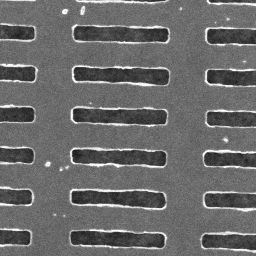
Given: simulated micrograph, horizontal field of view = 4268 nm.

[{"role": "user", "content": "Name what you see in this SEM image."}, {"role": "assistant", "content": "holes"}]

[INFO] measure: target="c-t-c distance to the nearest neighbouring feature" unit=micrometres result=0.682